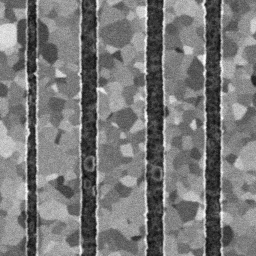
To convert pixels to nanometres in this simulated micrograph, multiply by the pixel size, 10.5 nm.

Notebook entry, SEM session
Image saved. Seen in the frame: one or a few lines or trenches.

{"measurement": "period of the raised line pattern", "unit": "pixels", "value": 62.8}